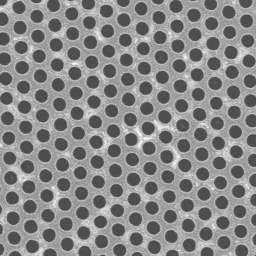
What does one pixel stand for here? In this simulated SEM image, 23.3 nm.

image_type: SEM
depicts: a regular array of holes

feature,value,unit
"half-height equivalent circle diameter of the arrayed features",0.318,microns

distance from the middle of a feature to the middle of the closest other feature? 459 nm